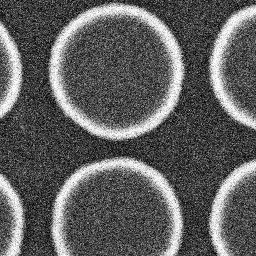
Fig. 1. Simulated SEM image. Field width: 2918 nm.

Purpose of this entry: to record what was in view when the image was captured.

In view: raised bodies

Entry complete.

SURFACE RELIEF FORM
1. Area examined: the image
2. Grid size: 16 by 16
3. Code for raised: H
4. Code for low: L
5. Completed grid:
LLLLLLLHLLLLLLLL
LLLLLHHHHHLLLLHH
HLLLHHHHHHHLLLHH
HLLHHHHHHHHLLHHH
HLLHHHHHHHHLLHHH
HLLLHHHHHHHLLLHH
HLLLHHHHHHHLLLHH
LLLLLHHHHHLLLLLH
LLLLLLLLLLLLLLLL
LLLLLLLLLLLLLLLL
LLLLLLHHHLLLLLLH
LLLLHHHHHHLLLLHH
HLLLHHHHHHHLLLHH
HLLLHHHHHHHLLHHH
HLLLHHHHHHHLLHHH
HLLLHHHHHHHLLLHH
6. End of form